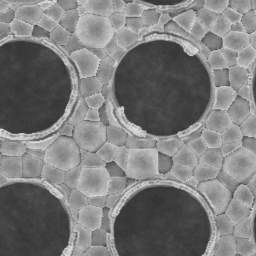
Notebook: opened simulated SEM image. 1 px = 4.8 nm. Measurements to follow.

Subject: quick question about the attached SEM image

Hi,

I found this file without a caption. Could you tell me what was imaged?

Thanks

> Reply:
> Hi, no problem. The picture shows holes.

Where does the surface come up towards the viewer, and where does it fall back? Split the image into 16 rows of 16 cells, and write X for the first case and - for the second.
XXXXXXXXXXXXXXXX
XXXXXXXXXXXXXXXX
X-XXXXXXXXXXXXXX
----XXXX----XXXX
----XXX------XXX
-----XX------XXX
----XXX------XXX
----XXXX----XXXX
XXXXXXXXXXXXXXXX
XXXXXXXXXXXXXXXX
XXXXXXXXXXXXXXXX
--XXXXXXXXXXXXXX
----XXXX----XXXX
----XXX------XXX
----XXX------XXX
----XXX------XXX